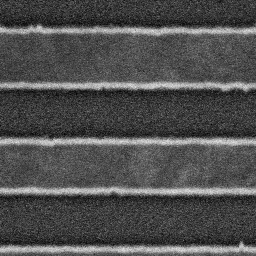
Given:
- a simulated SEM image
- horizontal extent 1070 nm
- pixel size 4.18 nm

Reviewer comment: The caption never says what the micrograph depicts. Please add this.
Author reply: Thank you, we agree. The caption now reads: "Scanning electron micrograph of one or a few lines or trenches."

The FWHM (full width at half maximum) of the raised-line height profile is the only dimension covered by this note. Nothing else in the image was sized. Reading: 52.2 px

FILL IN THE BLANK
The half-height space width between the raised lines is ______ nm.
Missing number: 238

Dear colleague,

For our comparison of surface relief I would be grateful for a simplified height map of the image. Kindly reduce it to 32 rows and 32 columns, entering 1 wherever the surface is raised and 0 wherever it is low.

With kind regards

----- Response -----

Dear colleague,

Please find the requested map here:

00000000000000000000000000000000
00000000000000000000000000000000
00000000000000000000000000000000
00000000000000000000000000000000
11111111111111111111111111111111
11111111111111111111111111111111
11111111111111111111111111111111
11111111111111111111111111111111
11111111111111111111111111111111
11111111111111111111111111111111
11111111111111111111111111111111
00000000000000000000000000000000
00000000000000000000000000000000
00000000000000000000000000000000
00000000000000000000000000000000
00000000000000000000000000000000
00000000000000000000000000000000
00000000000000000000000000000000
11111111111111111111111111111111
11111111111111111111111111111111
11111111111111111111111111111111
11111111111111111111111111111111
11111111111111111111111111111111
11111111111111111111111111111111
00000000000000000000000000000000
00000000000000000000000000000000
00000000000000000000000000000000
00000000000000000000000000000000
00000000000000000000000000000000
00000000000000000000000000000000
00000000000000000000000000000000
11111111111111111111111111111111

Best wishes